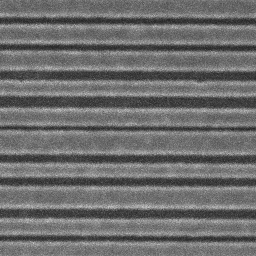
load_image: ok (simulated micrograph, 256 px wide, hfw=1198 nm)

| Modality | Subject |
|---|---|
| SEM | parallel lines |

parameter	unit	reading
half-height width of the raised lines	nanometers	82.5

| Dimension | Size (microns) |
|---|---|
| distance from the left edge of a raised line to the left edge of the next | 0.129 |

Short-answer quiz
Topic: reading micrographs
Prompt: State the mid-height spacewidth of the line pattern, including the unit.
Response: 45 nm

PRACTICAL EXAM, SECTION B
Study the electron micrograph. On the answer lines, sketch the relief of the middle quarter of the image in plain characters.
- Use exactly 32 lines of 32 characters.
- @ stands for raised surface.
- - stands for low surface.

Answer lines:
@@@@@@@@@@@@@@@@@@@@@@@@@@@@@@@@
----------@@@@@@-@@@@@@@@@@@@@@@
--------------------------------
--------------------------------
@@@@@@@@@@@@@@@@@@@@@@@@@@@@@@@@
@@@@@@@@@@@@@@@@@@@@@@@@@@@@@@@@
@@@@@@@@@@@@@@@@@@@@@@@@@@@@@@@@
@@@@@@@@@@@@@@@@@@@@@@@@@@@@@@@@
--------------------------------
--------------------------------
--------------------------------
@@@@@@@@@@@@@@@@@@@@@@@@@@@@@@@@
@@@@@@@@@@@@@@@@@@@@@@@@@@@@@@@@
@@@@@@@@@@@@@@@@@@@@@@@@@@@@@@@@
@@@@@@@@@@@@@@@@@@@@@@@@@@@@@@@@
--------------@-----------------
--------------------------------
@@@@@@@@@@@@@@@@@@@@@@@@@@@@@@@@
@@@@@@@@@@@@@@@@@@@@@@@@@@@@@@@@
@@@@@@@@@@@@@@@@@@@@@@@@@@@@@@@@
@@@@@@@@@@@@@@@@@@@@@@@@@@@@@@@@
@@@@@@@@@@@@@@@@@@@@@@@@@@@@@@@@
--------------------------------
--------------------------------
--------------------------------
@@@@@@@@@@@@@@@@@@@@@@@@@@@@@@@@
@@@@@@@@@@@@@@@@@@@@@@@@@@@@@@@@
@@@@@@@@@@@@@@@@@@@@@@@@@@@@@@@@
--------------------------------
--------------------------------
--------------------------------
@@@@@@@@@@@@@@@@@@@@@@@@@@@@@@@@